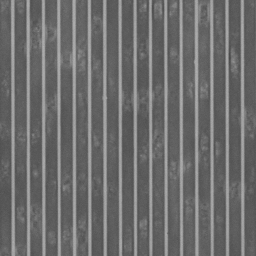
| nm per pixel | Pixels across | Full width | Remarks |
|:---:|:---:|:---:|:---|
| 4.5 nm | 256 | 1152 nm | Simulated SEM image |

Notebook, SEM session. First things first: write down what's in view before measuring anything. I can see parallel lines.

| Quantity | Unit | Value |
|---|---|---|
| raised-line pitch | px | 15.3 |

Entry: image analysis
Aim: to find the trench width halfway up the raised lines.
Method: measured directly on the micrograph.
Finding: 12.7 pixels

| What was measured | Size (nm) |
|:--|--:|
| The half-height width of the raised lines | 11.2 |